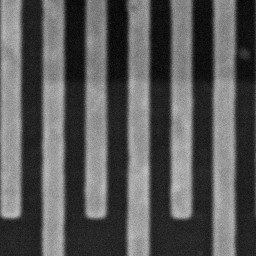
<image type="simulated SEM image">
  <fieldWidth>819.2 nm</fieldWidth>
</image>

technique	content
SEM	wiring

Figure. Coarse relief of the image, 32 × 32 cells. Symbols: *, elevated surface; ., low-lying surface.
**....**...**...**....**...**...
**....**...**...**....**...**...
**....**...**...**....**...**...
**....**...**...**....**...**...
**....**...**...**....**...**...
**....**...**...**....**...**...
**....**...**...**....**...**...
**....**...**...**....**...**...
**....**...**...**....**...**...
**....**...**...**....**...**...
**....**...**...**....**...**...
**....**...**...**....**...**...
**....**...**...**....**...**...
**....**...**...**....**...**...
**....**...**...**....**...**...
**....**...**...**....**...**...
**....**...**...**....**...**...
**....**...**...**....**...**...
**....**...**...**....**...**...
**....**...**...**....**...**...
**....**...**...**....**...**...
**....**...**...**....**...**...
**....**...**...**....*....**...
**....**...**...**....**...**...
**....**...**...**....**...**...
**....**...**...**....**...**...
**....**...**...**....**...**...
......**........**.........**...
......**........**.........**...
......**........**.........**...
......**........**.........**...
......**........**.........**...